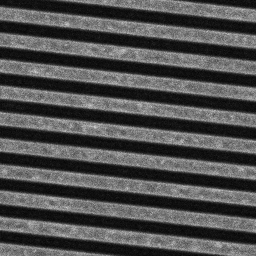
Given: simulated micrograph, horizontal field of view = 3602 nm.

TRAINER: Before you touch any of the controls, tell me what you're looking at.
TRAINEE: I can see parallel lines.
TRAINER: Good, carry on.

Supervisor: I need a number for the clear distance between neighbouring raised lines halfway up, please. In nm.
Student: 168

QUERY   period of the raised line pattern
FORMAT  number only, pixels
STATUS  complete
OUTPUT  26.1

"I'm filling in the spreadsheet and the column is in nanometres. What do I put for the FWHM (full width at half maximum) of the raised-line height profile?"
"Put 205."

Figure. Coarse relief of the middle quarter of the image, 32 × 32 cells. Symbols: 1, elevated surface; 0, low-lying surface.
00000000000000000000000000011111
11111111000000000000000000000000
11111111111111111000000000000000
11111111111111111111111111000000
00000111111111111111111111111111
00000000000000111111111111111111
00000000000000000000000111111111
11110000000000000000000000000000
11111111111110000000000000000000
11111111111111111111110000000000
11111111111111111111111111111110
00000000111111111111111111111111
00000000000000000111111111111111
00000000000000000000000000111111
11111110000000000000000000000000
11111111111111110000000000000000
11111111111111111111111110000000
00111111111111111111111111111111
00000000000111111111111111111111
00000000000000000000111111111111
11100000000000000000000000000111
11111111111000000000000000000000
11111111111111111111000000000000
11111111111111111111111111111000
00000001111111111111111111111111
00000000000000001111111111111111
00000000000000000000000001111111
11111000000000000000000000000000
11111111111111000000000000000000
11111111111111111111111110000000
01111111111111111111111111111111
00000000001111111111111111111111